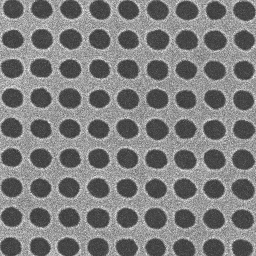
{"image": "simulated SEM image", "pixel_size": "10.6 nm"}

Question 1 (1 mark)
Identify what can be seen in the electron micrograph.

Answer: a regular array of holes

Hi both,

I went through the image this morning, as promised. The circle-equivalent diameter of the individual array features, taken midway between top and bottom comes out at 225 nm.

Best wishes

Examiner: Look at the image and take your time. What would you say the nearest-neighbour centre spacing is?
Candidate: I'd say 28.8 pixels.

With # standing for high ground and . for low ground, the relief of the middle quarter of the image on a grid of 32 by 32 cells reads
....##.....##......##.....##....
....##......#......##.....##....
....###....###.....##.....##....
...#####..#####...####...####...
################################
################################
...#####..#####..#####...#####..
....##.....##.....###.....##....
....##......#......#......##....
....##.....##......##.....##....
....###...####....###.....###...
###############..###############
################################
################################
...####...####....###....###....
....##.....##.....###.....##....
....##......#......#......##....
....##.....###....###.....##....
#..#####..#####..#####...####...
################################
################################
...####...####...#####..#####..#
....##.....##.....###....###....
....##.....##......#......#.....
....##.....##......#......##....
....###....###....###....###....
################################
################################
..######.#######################
...###.....##.....###....###....
....##.....##.....##......#.....
....##.....##.....##......##....